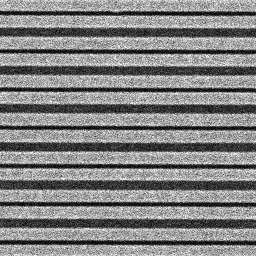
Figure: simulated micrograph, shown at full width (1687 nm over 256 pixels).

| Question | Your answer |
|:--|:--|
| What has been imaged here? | parallel lines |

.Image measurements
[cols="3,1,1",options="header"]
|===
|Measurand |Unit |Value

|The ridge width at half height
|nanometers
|82.3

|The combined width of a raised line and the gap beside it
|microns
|0.128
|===